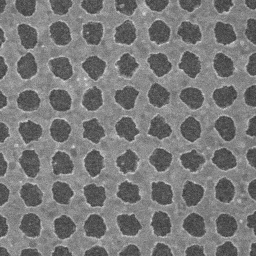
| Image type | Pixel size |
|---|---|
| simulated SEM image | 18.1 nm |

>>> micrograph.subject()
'a regular array of holes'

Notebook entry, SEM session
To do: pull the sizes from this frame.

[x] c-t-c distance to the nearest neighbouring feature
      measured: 561 nm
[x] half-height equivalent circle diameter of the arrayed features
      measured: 413 nm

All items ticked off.